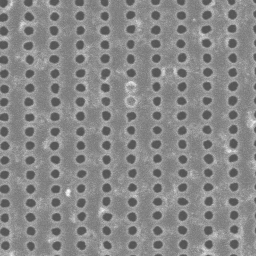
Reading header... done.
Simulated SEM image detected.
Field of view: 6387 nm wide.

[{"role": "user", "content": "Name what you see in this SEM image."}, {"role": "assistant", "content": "a regular array of holes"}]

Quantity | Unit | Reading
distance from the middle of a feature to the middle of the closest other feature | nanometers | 351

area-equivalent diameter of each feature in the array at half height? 9.51 pixels